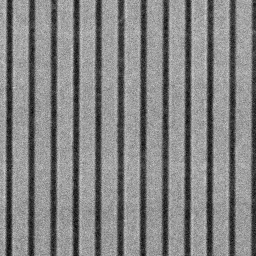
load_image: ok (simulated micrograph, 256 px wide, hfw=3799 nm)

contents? parallel lines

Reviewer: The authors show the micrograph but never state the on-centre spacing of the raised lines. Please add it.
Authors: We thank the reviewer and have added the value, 331 nanometres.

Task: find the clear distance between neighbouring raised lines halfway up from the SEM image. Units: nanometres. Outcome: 113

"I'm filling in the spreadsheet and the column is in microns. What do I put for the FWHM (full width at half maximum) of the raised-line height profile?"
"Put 0.22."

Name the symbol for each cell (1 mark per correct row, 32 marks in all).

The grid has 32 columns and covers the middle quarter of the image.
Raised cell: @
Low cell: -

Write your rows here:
@@--@@@@--@@@--@@@@--@@@--@@@@--
@@--@@@@--@@@--@@@@--@@@--@@@@--
@@--@@@@--@@@--@@@@--@@@--@@@@--
@@--@@@---@@@--@@@@--@@@---@@@--
@@--@@@---@@@--@@@@--@@@---@@@--
@@--@@@---@@@--@@@@--@@@---@@@--
@@--@@@---@@@--@@@@--@@@---@@@--
@@--@@@---@@@--@@@@--@@@---@@@--
@@--@@@---@@@--@@@@--@@@---@@@--
@@--@@@---@@@--@@@@--@@@--@@@@--
@@--@@@---@@@--@@@@--@@@--@@@@--
@@--@@@---@@@--@@@@--@@@--@@@@--
@@--@@@---@@@--@@@@--@@@--@@@@--
@@--@@@---@@@--@@@@--@@@---@@@--
@@--@@@---@@@--@@@@--@@@---@@@--
@@--@@@---@@@--@@@@--@@@---@@@--
@@--@@@---@@@--@@@@--@@@---@@@--
@@--@@@---@@@--@@@@--@@@---@@@--
@@--@@@---@@@--@@@@--@@@---@@@--
@@--@@@---@@@--@@@@--@@@---@@@--
@@--@@@---@@@--@@@@--@@@--@@@@--
@@--@@@---@@@--@@@@--@@@--@@@@--
@@--@@@---@@@--@@@@--@@@--@@@@--
@@--@@@---@@@--@@@@--@@@---@@@--
@@--@@@---@@@--@@@@--@@@---@@@--
@@--@@@---@@@--@@@@--@@@---@@@--
@@--@@@---@@@--@@@@--@@@---@@@--
@@--@@@---@@@--@@@@--@@@---@@@--
@@--@@@---@@@--@@@@--@@@---@@@--
@@--@@@---@@@--@@@@--@@@--@@@@--
@@--@@@---@@@--@@@@--@@@--@@@@--
@@--@@@---@@@--@@@@--@@@--@@@@--